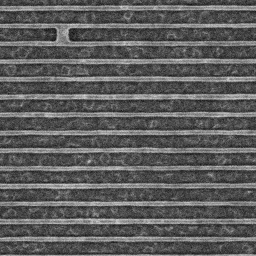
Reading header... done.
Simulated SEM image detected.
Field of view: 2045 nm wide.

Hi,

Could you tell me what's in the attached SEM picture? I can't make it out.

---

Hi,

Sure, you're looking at parallel lines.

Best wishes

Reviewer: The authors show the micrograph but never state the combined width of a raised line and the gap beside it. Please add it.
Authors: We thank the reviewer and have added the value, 142 nanometres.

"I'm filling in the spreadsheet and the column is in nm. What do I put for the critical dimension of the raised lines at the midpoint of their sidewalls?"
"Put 34.9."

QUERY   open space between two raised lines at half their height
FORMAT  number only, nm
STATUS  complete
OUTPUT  107